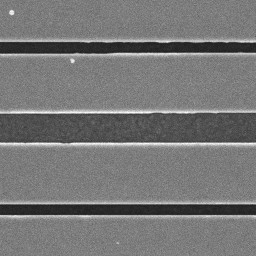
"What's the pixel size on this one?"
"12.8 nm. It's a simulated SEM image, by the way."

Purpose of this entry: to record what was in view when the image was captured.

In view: lines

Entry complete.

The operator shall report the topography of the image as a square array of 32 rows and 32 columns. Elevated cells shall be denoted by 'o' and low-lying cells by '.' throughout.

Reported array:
oooooooooooooooooooooooooooooooo
oooooooooooooooooooooooooooooooo
oooooooooooooooooooooooooooooooo
oooooooooooooooooooooooooooooooo
oooooooooooooooooooooooooooooooo
................................
................................
oooooooooooooooooooooooooooooooo
oooooooooooooooooooooooooooooooo
oooooooooooooooooooooooooooooooo
oooooooooooooooooooooooooooooooo
oooooooooooooooooooooooooooooooo
oooooooooooooooooooooooooooooooo
oooooooooooooooooooooooooooooooo
................................
................................
................................
................................
oooooooooooooooooooooooooooooooo
oooooooooooooooooooooooooooooooo
oooooooooooooooooooooooooooooooo
oooooooooooooooooooooooooooooooo
oooooooooooooooooooooooooooooooo
oooooooooooooooooooooooooooooooo
oooooooooooooooooooooooooooooooo
................................
................................
oooooooooooooooooooooooooooooooo
oooooooooooooooooooooooooooooooo
oooooooooooooooooooooooooooooooo
oooooooooooooooooooooooooooooooo
oooooooooooooooooooooooooooooooo